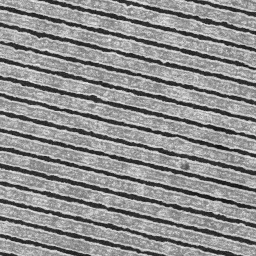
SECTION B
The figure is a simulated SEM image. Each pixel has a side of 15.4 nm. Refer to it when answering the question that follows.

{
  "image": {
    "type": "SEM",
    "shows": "parallel lines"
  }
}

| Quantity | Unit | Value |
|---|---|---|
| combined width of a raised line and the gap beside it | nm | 263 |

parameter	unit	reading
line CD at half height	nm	180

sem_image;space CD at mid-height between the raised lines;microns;0.0898